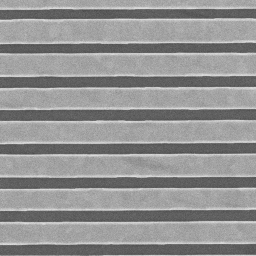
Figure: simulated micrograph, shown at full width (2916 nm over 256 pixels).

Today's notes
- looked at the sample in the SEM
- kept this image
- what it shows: wiring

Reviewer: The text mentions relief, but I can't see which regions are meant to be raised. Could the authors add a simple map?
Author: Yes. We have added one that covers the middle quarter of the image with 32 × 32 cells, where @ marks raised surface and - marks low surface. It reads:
@@@@@@@@@@@@@@@@@@@@@@@@@@@@@@@@
@@@@@@@@@@@@@@@@@@@@@@@@@@@@@@@@
@@@@@@@@@@@@@@@@@@@@@@@@@@@@@@@@
--------------------------------
--------------------------------
--------------------------------
@@@@@@@@@@@@@@@@@@@@@@@@@@@@@@@@
@@@@@@@@@@@@@@@@@@@@@@@@@@@@@@@@
@@@@@@@@@@@@@@@@@@@@@@@@@@@@@@@@
@@@@@@@@@@@@@@@@@@@@@@@@@@@@@@@@
@@@@@@@@@@@@@@@@@@@@@@@@@@@@@@@@
--------------------------------
--------------------------------
--------------------------------
@@@@@@@@@@@@@@@@@@@@@@@@@@@@@@@@
@@@@@@@@@@@@@@@@@@@@@@@@@@@@@@@@
@@@@@@@@@@@@@@@@@@@@@@@@@@@@@@@@
@@@@@@@@@@@@@@@@@@@@@@@@@@@@@@@@
@@@@@@@@@@@@@@@@@@@@@@@@@@@@@@@@
@@@@@@@@@@@@@@@@@@@@@@@@@@@@@@@@
--------------------------------
--------------------------------
--------------------------------
@@@@@@@@@@@@@@@@@@@@@@@@@@@@@@@@
@@@@@@@@@@@@@@@@@@@@@@@@@@@@@@@@
@@@@@@@@@@@@@@@@@@@@@@@@@@@@@@@@
@@@@@@@@@@@@@@@@@@@@@@@@@@@@@@@@
@@@@@@@@@@@@@@@@@@@@@@@@@@@@@@@@
--------------------------------
--------------------------------
--------------------------------
@@@@@@@@@@@@@@@@@@@@@@@@@@@@@@@@